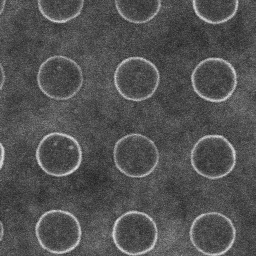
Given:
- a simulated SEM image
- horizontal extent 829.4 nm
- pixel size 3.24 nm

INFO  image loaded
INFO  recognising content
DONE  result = a regular array of raised bodies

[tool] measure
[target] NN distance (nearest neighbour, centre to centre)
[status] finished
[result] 249 nm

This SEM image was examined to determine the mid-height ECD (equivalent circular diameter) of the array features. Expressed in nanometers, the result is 141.